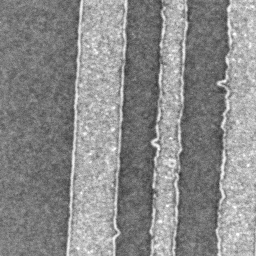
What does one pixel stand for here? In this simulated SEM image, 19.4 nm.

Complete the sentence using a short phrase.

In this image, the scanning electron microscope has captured one or a few lines or trenches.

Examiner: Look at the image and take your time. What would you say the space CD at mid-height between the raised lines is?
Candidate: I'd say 768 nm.